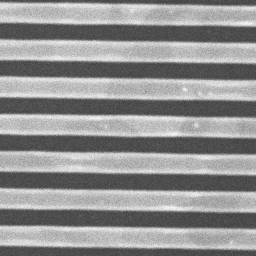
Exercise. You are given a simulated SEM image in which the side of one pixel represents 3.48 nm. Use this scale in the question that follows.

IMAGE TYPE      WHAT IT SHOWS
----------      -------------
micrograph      wiring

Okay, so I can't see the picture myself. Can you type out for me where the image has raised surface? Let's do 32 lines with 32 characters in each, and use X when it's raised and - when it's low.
XXXXXXXXX-----------------------
XXXXXXXXXXXXXXXXXXXXXXXXXXXXXXXX
XXXXXXXXXXXXXXXXXXXXXXXXXXXXXXXX
--------------------------------
--------------------------------
XXXXXXXXXXXXXXXXXXXXXXXXXXXXXXXX
XXXXXXXXXXXXXXXXXXXXXXXXXXXXXXXX
----------XXXXXXXXXXXXXXXXXXXXXX
--------------------------------
--------------------------------
XXXXXXXXXXXXXXXXXXXXXXXXXXXXXXXX
XXXXXXXXXXXXXXXXXXXXXXXXXXXXXXXX
-------------------------------X
--------------------------------
XXXXXXXXXXXXXXXXXX--------------
XXXXXXXXXXXXXXXXXXXXXXXXXXXXXXXX
XXXXXXXXXXXXXXXXXXXXXXXXXXXXXXXX
--------------------------------
--------------------------------
XXXXXXXXXXXXXXXXXXXXXXXXXXXXXXXX
XXXXXXXXXXXXXXXXXXXXXXXXXXXXXXXX
----------XXXXXXXXXXXXXXXXXXXXXX
--------------------------------
--------------------------------
XXXXXXXXXXXXXXXXXXXXXXXXXXXXXXXX
XXXXXXXXXXXXXXXXXXXXXXXXXXXXXXXX
--------------------------------
--------------------------------
XXXXXXXXXXXX--------------------
XXXXXXXXXXXXXXXXXXXXXXXXXXXXXXXX
XXXXXXXXXXXXXXXXXXXXXXXXXXXXXXXX
--------------------------------